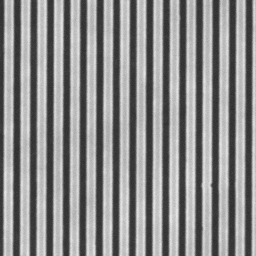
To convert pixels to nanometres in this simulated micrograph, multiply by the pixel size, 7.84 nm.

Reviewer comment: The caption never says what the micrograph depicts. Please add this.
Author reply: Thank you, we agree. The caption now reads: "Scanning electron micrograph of parallel lines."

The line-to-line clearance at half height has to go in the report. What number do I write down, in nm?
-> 62.7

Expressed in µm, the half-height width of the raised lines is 0.0627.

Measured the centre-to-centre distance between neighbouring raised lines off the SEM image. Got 16.6 pixels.